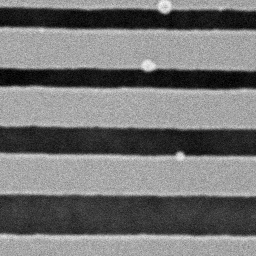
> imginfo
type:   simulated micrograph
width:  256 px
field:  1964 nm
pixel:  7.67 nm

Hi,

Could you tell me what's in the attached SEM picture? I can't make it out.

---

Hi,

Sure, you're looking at lines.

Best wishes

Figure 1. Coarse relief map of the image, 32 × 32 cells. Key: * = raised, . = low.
********************************
....................*...........
................................
*...............................
********************************
********************************
********************************
********************************
..********..********************
................................
................................
********************************
********************************
********************************
********************************
********************************
................................
................................
................................
***************.......*.........
********************************
********************************
********************************
********************************
..............................*.
................................
................................
................................
................................
************************..***...
********************************
********************************